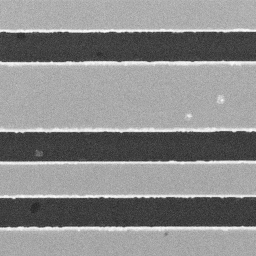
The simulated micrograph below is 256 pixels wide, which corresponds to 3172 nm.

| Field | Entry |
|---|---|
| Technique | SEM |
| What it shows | lines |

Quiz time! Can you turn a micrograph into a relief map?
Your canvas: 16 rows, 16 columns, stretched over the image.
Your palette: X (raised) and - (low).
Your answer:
XXXXXXXXXXXXXXXX
XXXXXXXXXXXXXXXX
----------------
----------------
XXXXXXXXXXXXXXXX
XXXXXXXXXXXXXXXX
XXXXXXXXXXXXXXXX
XXXXXXXXXXXXXXXX
----------------
----------------
XXXXXXXXXXXXXXXX
XXXXXXXXXXXXXXXX
----------------
----------------
XXXXXXXXXXXXXXXX
XXXXXXXXXXXXXXXX